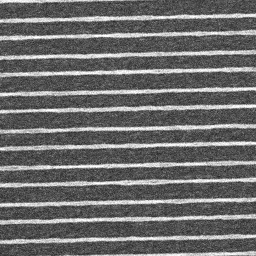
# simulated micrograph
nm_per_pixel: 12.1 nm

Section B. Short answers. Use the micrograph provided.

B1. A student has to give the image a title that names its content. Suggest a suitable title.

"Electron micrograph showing parallel lines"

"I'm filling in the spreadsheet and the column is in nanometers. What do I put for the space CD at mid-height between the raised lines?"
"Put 186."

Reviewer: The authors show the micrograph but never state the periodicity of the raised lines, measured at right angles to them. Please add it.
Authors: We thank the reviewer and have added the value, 223 nm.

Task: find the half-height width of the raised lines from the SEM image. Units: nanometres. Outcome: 37.8